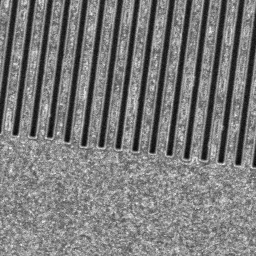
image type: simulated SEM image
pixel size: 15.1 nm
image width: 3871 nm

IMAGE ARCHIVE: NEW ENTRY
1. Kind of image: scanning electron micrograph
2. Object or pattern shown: parallel lines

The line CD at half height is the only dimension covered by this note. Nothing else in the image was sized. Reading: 157 nm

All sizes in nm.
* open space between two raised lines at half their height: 101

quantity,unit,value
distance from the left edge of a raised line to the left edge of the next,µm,0.261